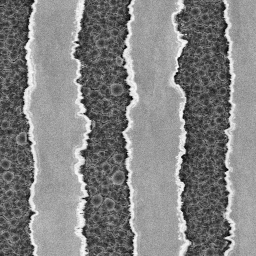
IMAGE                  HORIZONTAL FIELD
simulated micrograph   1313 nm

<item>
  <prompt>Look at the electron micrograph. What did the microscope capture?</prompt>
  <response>one or a few lines or trenches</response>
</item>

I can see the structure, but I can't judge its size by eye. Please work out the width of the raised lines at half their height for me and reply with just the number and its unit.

0.259 µm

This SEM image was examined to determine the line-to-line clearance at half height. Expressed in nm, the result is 250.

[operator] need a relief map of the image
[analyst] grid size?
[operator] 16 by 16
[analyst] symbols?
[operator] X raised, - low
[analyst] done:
--XXX---XXX---XX
--XXX---XXX---XX
--XXX---XXX---XX
--XXX---XXX---XX
--XXX---XXX---XX
--XXX---X-X---XX
--XXX---XXXX--XX
--XXX---XXX---XX
--XXX---XXXX--XX
--XXX---XXX---XX
--XXX---XXX---XX
--XXX---XXX---XX
--XXX---XXX---XX
--XXX---XXX---XX
--XXX---XXXX--XX
--XXX---XXXX--XX